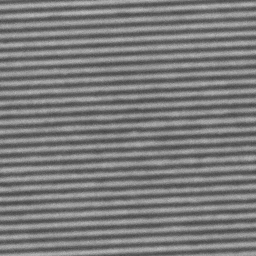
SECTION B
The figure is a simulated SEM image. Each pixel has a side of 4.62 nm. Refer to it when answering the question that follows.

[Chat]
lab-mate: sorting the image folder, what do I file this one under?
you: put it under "parallel lines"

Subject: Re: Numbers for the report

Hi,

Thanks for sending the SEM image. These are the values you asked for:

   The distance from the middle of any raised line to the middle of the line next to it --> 44.3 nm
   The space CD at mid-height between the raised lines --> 31.1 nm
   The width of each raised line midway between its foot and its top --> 13.3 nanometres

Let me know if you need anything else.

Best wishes